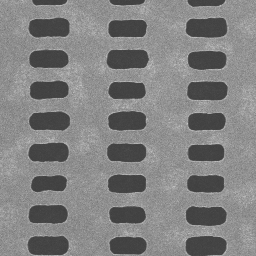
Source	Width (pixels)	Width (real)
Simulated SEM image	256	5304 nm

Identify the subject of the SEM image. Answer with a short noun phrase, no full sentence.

a regular array of holes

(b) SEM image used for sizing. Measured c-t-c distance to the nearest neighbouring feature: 0.641 microns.